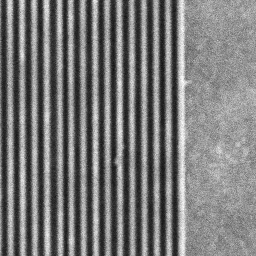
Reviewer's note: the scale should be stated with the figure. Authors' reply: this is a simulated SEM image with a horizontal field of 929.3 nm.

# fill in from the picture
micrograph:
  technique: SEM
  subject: parallel lines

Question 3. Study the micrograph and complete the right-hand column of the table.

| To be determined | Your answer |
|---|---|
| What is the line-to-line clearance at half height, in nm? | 21.3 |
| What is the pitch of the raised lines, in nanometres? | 44.2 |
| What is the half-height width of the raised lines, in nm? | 21.3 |